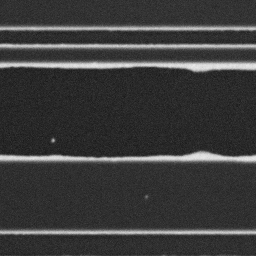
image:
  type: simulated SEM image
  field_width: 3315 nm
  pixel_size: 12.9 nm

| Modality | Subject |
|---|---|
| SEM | lines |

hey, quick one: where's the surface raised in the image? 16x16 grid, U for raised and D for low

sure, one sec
UUUUUUUUUUUUUUUU
UUUUUUUUUUUUUUUU
UUUUUUUUUUUUUUUU
UUUUUUUUUUUUUUUU
DDDDDDDDDDDDDDDD
DDDDDDDDDDDDDDDD
DDDDDDDDDDDDDDDD
DDDDDDDDDDDDDDDD
DDDDDDDDDDDDDDDD
DDDDDDDDDDDDDDDD
UUUUUUUUUUUUUUUU
UUUUUUUUUUUUUUUU
UUUUUUUUUUUUUUUU
UUUUUUUUUUUUUUUU
UUUUUUUUUUUUUUUU
UUUUUUUUUUUUUUUU